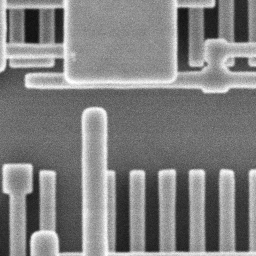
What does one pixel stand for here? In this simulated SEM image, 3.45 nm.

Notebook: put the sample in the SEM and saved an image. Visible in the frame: wiring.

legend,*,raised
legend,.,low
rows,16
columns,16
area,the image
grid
....*******.....
....*******.....
....*******.....
....*******.....
....*******.....
................
................
.....**.........
.....**.........
.....**.........
.....**.........
.....**.........
.....**.........
.....**.........
..*..**.........
..**.**.........